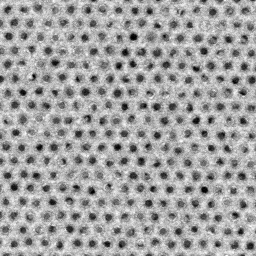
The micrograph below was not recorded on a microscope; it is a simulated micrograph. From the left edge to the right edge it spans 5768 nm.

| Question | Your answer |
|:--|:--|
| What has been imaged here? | a regular array of raised bodies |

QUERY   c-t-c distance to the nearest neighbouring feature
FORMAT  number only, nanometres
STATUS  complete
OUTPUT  324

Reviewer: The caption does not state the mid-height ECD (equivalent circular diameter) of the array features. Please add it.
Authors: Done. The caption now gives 180 nm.